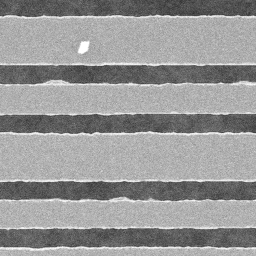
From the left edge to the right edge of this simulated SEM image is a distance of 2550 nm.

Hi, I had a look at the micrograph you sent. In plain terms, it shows lines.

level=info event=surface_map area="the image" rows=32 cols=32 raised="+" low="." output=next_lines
................................
................................
++++++++++++++++++++++++++++++++
++++++++++++++++++++++++++++++++
++++++++++++++++++++++++++++++++
++++++++++++++++++++++++++++++++
++++++++++++++++++++++++++++++++
++++++++++++++++++++++++++++++++
................................
................................
.......................+...+....
++++++++++++++++++++++++++++++++
++++++++++++++++++++++++++++++++
++++++++++++++++++++++++++++++++
................................
................................
................................
++++++++++++++++++++++++++++++++
++++++++++++++++++++++++++++++++
++++++++++++++++++++++++++++++++
++++++++++++++++++++++++++++++++
++++++++++++++++++++++++++++++++
++++++++++++++++++++++++++++++++
................................
................................
++++++++++++++++++++++++++++++++
++++++++++++++++++++++++++++++++
++++++++++++++++++++++++++++++++
++++++++++++++++....+++.++++....
................................
................................
++++++++++++++++++++++++++++++++